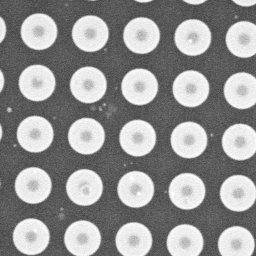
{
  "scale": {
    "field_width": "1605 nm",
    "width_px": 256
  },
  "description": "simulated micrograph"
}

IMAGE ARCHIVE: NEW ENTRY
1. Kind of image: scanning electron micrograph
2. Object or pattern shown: an array of small figures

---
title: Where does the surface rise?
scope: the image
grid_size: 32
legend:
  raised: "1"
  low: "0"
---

00000000000000000000000000000011
00000000000000000000000000000000
00011110001110000110000000000000
10011110011110001111001111000111
10011110011110001111001111001111
00011100011110001111001111001111
00000000000000000110000110000111
00000000000000000000000000000000
00011100001100000000000000000000
00011110011110001110001110000111
00111110011110011111001111001111
00011110011110011111001111001111
00001000001100001110001111001111
00000000000000000000000000000010
00000000000000000000000000000000
00011100011100001110000110000000
00111110011110011110001111001111
00111110011110011110011111001111
00011100011100011110001111001111
00000000000000000000000110000110
00000000000000000000000000000000
00011100011100001100000000000000
00111100011110011110001110001110
00111100111110011110011111001111
00111100011110011110011111001111
00000000001000001100001110001111
00000000000000000000000000000000
00011000000000000000000000000000
00111100011100011100001100000100
00111100111110011110011110001110
00111100111100011110011110011111
00011000011100011100011110001111